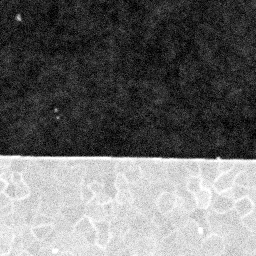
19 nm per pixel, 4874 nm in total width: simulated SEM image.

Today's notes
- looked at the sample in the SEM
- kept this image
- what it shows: wiring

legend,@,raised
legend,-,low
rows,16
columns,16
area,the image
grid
----------------
----------------
----------------
----------------
----------------
----------------
----------------
----------------
----------------
----------------
@@@@@@@@@@@@@@@@
@@@@@@@@@@@@@@@@
@@@@@@@@@@@@@@@@
@@@@@@@@@@@@@@@@
@@@@@@@@@@@@@@@@
@@@@@@@@@@@@@@@@